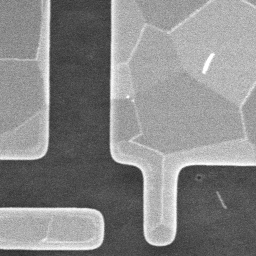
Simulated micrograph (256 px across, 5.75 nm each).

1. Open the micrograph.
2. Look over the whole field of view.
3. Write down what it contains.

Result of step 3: wiring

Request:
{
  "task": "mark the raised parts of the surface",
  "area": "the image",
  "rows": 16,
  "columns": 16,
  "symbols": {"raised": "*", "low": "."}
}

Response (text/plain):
***....*********
***....*********
***....*********
***....*********
***....*********
***....*********
***....*********
***....*********
***....*********
***....*********
.........***....
.........**.....
.........**.....
******...**.....
******...**.....
******..........